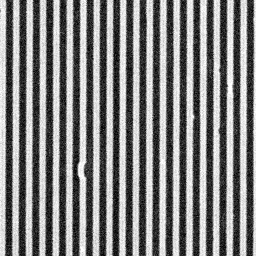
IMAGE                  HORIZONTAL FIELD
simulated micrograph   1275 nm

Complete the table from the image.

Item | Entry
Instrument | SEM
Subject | parallel lines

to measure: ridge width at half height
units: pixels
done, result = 5.74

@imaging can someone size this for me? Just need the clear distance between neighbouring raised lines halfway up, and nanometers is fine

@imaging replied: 38.6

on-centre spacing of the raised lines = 66.6 nm